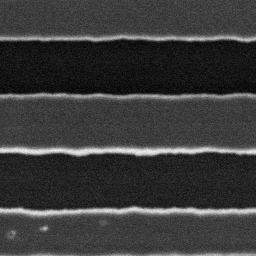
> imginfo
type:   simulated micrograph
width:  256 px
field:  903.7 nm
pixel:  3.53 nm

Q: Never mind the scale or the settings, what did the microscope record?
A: lines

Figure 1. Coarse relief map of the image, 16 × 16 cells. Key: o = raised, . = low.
oooooooooooooooo
oooooooooooooooo
...............o
................
................
................
oooooooooooooooo
oooooooooooooooo
oooooooooooooooo
.oooooo.oooo..oo
................
................
................
oooooooooooooooo
oooooooooooooooo
oooooooooooooooo